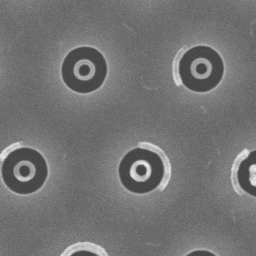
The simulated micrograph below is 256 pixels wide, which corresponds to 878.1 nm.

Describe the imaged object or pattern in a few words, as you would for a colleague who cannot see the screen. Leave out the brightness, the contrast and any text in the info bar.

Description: ring-shaped grooves with a dot in the middle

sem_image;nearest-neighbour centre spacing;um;0.399